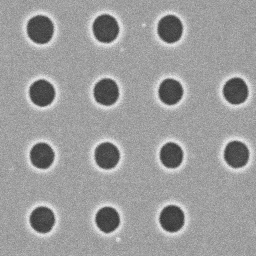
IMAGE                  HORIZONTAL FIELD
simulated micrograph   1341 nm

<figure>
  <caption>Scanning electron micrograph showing a regular array of holes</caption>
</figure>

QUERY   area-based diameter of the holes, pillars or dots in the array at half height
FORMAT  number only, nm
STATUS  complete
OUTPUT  141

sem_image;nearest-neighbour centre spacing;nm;332